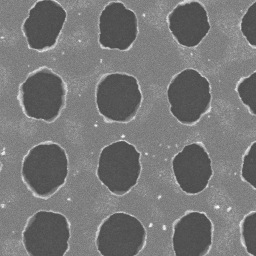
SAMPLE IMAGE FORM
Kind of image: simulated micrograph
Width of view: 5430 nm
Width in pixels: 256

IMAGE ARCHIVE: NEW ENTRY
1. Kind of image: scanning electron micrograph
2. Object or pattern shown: a regular array of holes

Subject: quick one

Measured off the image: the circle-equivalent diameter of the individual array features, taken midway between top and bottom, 0.982 micrometres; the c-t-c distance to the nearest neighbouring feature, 1510 nm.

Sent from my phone